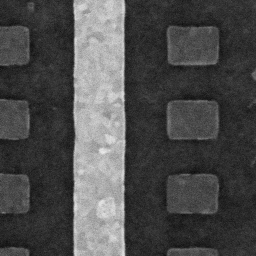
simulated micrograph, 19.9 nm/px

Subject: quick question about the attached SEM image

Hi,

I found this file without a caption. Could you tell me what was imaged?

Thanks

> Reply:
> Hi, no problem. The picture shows wiring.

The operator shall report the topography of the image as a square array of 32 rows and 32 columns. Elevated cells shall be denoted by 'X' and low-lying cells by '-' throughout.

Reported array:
---------XXXXXXX----------------
---------XXXXXXX----------------
---------XXXXXXX----------------
XXX------XXXXXX------XXXXXX-----
XXXX-----XXXXXX------XXXXXX-----
XXXX-----XXXXXX------XXXXXX-----
XXXX-----XXXXXX------XXXXXX-----
XXXX-----XXXXXX------XXXXXX-----
---------XXXXXX-----------------
---------XXXXXX-----------------
---------XXXXXX-----------------
---------XXXXXX-----------------
---------XXXXXX-----------------
XXXX-----XXXXXX------XXXXXX-----
XXXX-----XXXXXXX-----XXXXXX-----
XXXX-----XXXXXXX-----XXXXXX-----
XXXX-----XXXXXXX-----XXXXXX-----
---------XXXXXXX----------------
---------XXXXXXX----------------
---------XXXXXXX----------------
---------XXXXXX-----------------
---------XXXXXX-----------------
XXXX-----XXXXXX------XXXXXX-----
XXXX-----XXXXXX------XXXXXX-----
XXXX-----XXXXXX------XXXXXX-----
XXXX-----XXXXXX------XXXXXX-----
XXX------XXXXXX------XXXXXX-----
---------XXXXXX-----------------
---------XXXXXX-----------------
---------XXXXXX-----------------
---------XXXXXXX----------------
XXX------XXXXXXX-----XXXXXX-----